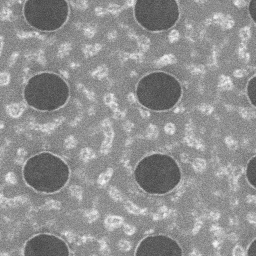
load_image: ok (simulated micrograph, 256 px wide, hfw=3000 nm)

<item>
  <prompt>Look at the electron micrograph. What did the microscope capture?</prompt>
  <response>raised bodies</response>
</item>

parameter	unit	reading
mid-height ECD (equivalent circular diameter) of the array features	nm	513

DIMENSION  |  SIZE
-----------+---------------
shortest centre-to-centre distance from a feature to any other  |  958 nm